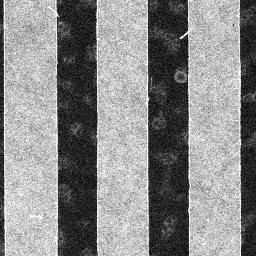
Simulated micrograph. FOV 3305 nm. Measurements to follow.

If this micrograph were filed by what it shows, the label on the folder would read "one or a few lines or trenches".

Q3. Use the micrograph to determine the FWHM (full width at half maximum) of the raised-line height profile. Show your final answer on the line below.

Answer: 50.7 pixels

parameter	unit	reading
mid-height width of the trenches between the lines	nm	528